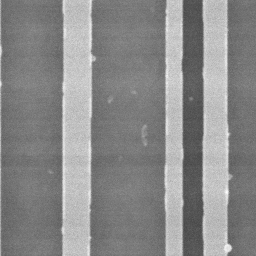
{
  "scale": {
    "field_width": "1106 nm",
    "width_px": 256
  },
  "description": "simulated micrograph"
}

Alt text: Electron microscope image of lines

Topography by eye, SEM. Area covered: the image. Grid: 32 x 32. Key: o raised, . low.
........ooo..........oo..ooo....
........ooo..........oo..ooo....
........ooo..........oo...oo....
........ooo..........oo...oo....
........ooo..........oo...oo....
........ooo..........oo...oo....
........ooo..........oo...oo....
........ooo..........oo...oo....
........ooo..........oo...oo....
........ooo..........oo...oo....
........ooo..........oo...oo....
........ooo..........oo...oo....
........ooo..........oo...oo....
........ooo..........oo...oo....
........ooo..........oo...oo....
........ooo..........oo...oo....
........ooo..........oo...oo....
........ooo..........oo...oo....
........ooo..........oo...oo....
........ooo..........oo..ooo....
........ooo..........oo..ooo....
........ooo..........oo..ooo....
........ooo..........oo..ooo....
........ooo..........oo..ooo....
........ooo..........oo..ooo....
........ooo..........oo...oo....
........ooo..........oo...oo....
........ooo..........oo..ooo....
........ooo..........oo..ooo....
........ooo..........oo..ooo....
........ooo..........oo...ooo...
........ooo..........oo...ooo...